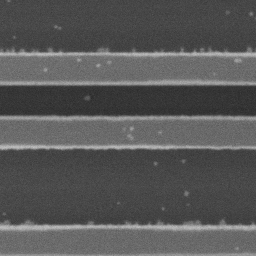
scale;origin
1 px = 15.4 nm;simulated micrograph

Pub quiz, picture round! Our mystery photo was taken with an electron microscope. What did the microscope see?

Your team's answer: lines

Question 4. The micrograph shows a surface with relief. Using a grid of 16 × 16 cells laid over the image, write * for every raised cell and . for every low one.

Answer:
................
................
................
****************
****************
................
................
****************
****************
................
................
................
................
................
****************
****************